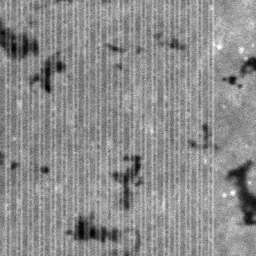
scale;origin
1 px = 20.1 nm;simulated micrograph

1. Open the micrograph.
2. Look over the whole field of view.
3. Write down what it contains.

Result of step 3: parallel lines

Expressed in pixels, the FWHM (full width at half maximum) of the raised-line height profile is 4.5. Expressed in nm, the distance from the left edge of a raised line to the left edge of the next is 227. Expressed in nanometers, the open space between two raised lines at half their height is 141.